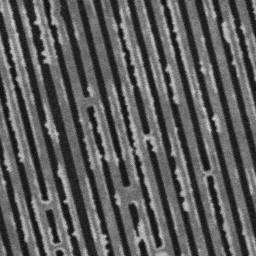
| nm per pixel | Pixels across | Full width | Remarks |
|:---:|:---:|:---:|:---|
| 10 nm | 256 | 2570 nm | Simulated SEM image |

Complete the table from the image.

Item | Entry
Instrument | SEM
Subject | parallel lines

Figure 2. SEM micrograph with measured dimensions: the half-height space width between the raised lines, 70.6 nanometres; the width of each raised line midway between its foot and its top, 94.9 nm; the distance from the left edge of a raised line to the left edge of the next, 164 nm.